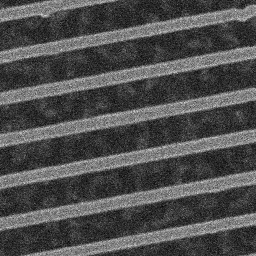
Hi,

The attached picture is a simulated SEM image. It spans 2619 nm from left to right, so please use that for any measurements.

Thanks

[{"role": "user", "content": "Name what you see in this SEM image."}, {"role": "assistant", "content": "parallel lines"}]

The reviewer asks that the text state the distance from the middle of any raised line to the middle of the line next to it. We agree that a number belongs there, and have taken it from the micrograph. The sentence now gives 0.418 microns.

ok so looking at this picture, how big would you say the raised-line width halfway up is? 121 nanometres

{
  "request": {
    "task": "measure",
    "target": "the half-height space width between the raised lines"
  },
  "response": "302 nm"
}